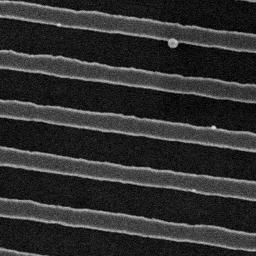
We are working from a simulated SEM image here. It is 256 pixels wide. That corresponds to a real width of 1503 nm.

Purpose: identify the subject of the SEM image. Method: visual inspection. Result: lines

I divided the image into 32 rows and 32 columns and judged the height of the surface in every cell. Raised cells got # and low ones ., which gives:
#####...........................
############....................
..#################.............
..........################......
.................###############
.....................#..########
##.............................#
##########......................
#################...............
.......################.........
..............################..
......................##########
.............................###
########........................
################................
.......#################........
..............#################.
.....................###########
#...........................####
########........................
###############.................
......################..........
............##################..
.....................###########
............................####
#####...........................
#############...................
....################............
...........#################....
..................##############
.........................#######
###.............................